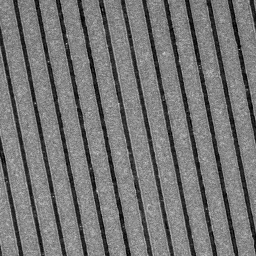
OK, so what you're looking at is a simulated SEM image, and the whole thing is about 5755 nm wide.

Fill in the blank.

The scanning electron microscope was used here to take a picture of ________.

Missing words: parallel lines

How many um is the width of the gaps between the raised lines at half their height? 0.113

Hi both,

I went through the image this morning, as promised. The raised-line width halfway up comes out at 375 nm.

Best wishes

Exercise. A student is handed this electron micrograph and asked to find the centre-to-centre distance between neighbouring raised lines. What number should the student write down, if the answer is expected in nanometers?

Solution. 474